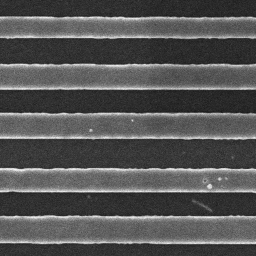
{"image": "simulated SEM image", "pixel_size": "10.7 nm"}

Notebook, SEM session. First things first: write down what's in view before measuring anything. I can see lines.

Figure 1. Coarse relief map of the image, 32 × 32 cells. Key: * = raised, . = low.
................................
................................
********************************
********************************
********************************
................................
................................
................................
********************************
********************************
********************************
................................
................................
................................
********************************
********************************
********************************
................................
................................
................................
................................
********************************
********************************
********************************
................................
................................
................................
********************************
********************************
********************************
................................
................................